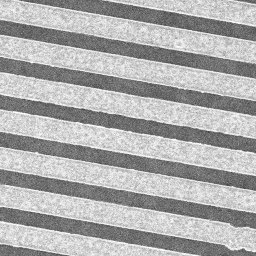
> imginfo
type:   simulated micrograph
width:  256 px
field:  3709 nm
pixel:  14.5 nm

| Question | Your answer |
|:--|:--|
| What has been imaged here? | parallel lines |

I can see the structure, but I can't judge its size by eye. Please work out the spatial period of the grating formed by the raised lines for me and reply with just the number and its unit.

534 nm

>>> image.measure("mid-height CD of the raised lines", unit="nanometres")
305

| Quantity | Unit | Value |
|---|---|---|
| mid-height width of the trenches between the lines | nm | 237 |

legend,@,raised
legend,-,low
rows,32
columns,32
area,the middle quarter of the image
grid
@@@@@@@@@@@@@@@@@@@@@@@@@@@@----
-----@@@@@@@@@@@@@@@@@@@@@@@@@@@
----------@@@@@@@@@@@@@@@@@@@@@@
----------------@@@@@@@@@@@@@@@@
---------------------@@@@@@@@@@@
@@@-------------------------@@@@
@@@@@@@@@-----------------------
@@@@@@@@@@@@@@@-----------------
@@@@@@@@@@@@@@@@@@@@------------
@@@@@@@@@@@@@@@@@@@@@@@@@@------
--@@@@@@@@@@@@@@@@@@@@@@@@@@@@@@
-------@@@@@@@@@@@@@@@@@@@@@@@@@
-------------@@@@@@@@@@@@@@@@@@@
-------------------@@@@@@@@@@@@@
@@-----------------------@@@@@@@
@@@@@@@------------------------@
@@@@@@@@@@@@@-------------------
@@@@@@@@@@@@@@@@@@@-------------
@@@@@@@@@@@@@@@@@@@@@@@@@-------
@@@@@@@@@@@@@@@@@@@@@@@@@@@@@@--
------@@@@@@@@@@@@@@@@@@@@@@@@@@
------------@@@@@@@@@@@@@@@@@@@@
-----------------@@@@@@@@@@@@@@@
-----------------------@@@@@@@@@
@@@@@------------------------@@@
@@@@@@@@@@----------------------
@@@@@@@@@@@@@@@@@---------------
@@@@@@@@@@@@@@@@@@@@@@@---------
@@@@@@@@@@@@@@@@@@@@@@@@@@@@----
----@@@@@@@@@@@@@@@@@@@@@@@@@@@@
----------@@@@@@@@@@@@@@@@@@@@@@
----------------@@@@@@@@@@@@@@@@